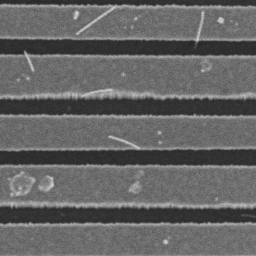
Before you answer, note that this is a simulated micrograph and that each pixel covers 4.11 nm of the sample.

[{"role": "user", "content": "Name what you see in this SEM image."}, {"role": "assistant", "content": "lines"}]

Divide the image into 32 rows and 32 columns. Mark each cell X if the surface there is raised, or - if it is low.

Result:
--------------------------------
XXXXXXXXXXXXXXXXXXXXXXXXXXXXXXXX
XXXXXXXXXXXXXXXXXXXXXXXXXXXXXXXX
XXXXXXXXXXXXXXXXXXXXXXXXXXXXXXXX
XXXXXXXXXXXXXXXXXXXXXXXXXXXXXXXX
--------------------------------
--------------------------------
XXXXXXXXXXXXXXXXXXXXXXXXXXXXXXXX
XXXXXXXXXXXXXXXXXXXXXXXXXXXXXXXX
XXXXXXXXXXXXXXXXXXXXXXXXXXXXXXXX
XXXXXXXXXXXXXXXXXXXXXXXXXXXXXXXX
XXXXXXXXXXXXXXXXXXXXXXXXXXXXXXXX
--------------------------------
--------------------------------
XXXXXXXXXXXXXXXXXXXXXXXXXXXXXXXX
XXXXXXXXXXXXXXXXXXXXXXXXXXXXXXXX
XXXXXXXXXXXXXXXXXXXXXXXXXXXXXXXX
XXXXXXXXXXXXXXXXXXXXXXXXXXXXXXXX
XXXXXXXXXXXXXXXXXXXXXXXXXXXXXXXX
--------------------------------
--------------------------------
XXXXXXXXXXXXXXXXXXXXXXXXXXXXXXXX
XXXXXXXXXXXXXXXXXXXXXXXXXXXXXXXX
XXXXXXXXXXXXXXXXXXXXXXXXXXXXXXXX
XXXXXXXXXXXXXXXXXXXXXXXXXXXXXXXX
XXXXXXXXXXXXXXXXXXXXXXXXXXXXXXXX
--------------------------------
--------------------------------
XXXXXXXXXXXXXXXXXXXXXXXXXXXXXXXX
XXXXXXXXXXXXXXXXXXXXXXXXXXXXXXXX
XXXXXXXXXXXXXXXXXXXXXXXXXXXXXXXX
XXXXXXXXXXXXXXXXXXXXXXXXXXXXXXXX